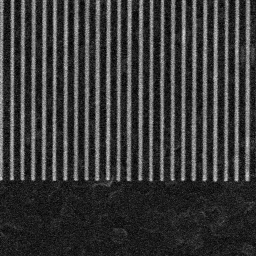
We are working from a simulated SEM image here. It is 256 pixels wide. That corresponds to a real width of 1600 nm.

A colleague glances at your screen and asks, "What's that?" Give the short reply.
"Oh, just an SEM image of parallel lines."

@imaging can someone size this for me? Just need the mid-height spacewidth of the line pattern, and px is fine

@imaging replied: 7.87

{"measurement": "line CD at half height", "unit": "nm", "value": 18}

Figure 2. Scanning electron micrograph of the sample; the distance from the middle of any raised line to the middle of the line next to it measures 10.7 px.